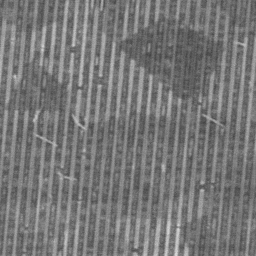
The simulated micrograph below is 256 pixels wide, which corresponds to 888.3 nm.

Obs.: parallel lines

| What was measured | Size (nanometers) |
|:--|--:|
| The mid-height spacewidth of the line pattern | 26.8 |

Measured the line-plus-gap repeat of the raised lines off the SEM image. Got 35 nanometres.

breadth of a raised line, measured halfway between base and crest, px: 2.62